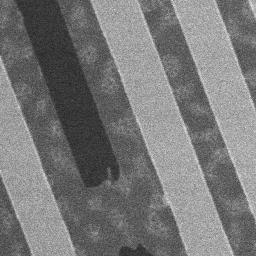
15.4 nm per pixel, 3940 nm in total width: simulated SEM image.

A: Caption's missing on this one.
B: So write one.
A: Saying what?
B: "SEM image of one or a few lines or trenches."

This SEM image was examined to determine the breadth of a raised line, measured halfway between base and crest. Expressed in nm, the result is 624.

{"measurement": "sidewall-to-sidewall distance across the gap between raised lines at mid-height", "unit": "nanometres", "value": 500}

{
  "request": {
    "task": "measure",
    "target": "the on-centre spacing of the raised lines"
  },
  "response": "73.7 pixels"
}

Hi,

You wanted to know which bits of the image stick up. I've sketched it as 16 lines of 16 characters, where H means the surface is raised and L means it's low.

LHHHLLHHHLLHHHLL
LHHHLLHHHLLHHHLL
LLHHHLLHHLLLHHLL
LLHHHLLHHHLLHHHL
LLLHHLLHHHLLHHHL
HLLHHHLLHHHLLHHL
HLLHHHLLHHHLLHHH
HLLLHHLLLHHLLLHH
HHLLHHHLLHHHLLHH
HHLLHHHLLHHHLLHH
HHHLLHHLLLHHLLLH
HHHLLHLLLLHHHLLH
LHHLLLLLLLHHHLLL
LHHHLLLLLLLHHHLL
LLHHLLLLLLLHHHLL
LLHHHLLLHLLLHHLL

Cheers